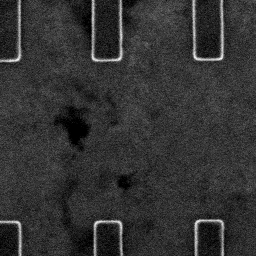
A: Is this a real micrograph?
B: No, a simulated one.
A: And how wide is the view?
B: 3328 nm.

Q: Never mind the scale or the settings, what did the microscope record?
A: wiring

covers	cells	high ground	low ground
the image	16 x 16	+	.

+.....++....++..
+.....++....++..
+.....++....++..
+.....+.....++..
................
................
................
................
................
................
................
................
................
................
+.....++....++..
+.....++....++..